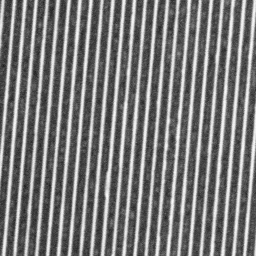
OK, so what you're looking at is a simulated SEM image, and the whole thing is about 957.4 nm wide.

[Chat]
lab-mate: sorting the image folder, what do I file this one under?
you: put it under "parallel lines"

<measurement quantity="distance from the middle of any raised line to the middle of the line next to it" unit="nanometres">40.8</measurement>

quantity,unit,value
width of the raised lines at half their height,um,0.0075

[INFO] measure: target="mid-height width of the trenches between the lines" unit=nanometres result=32.1